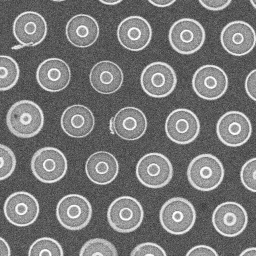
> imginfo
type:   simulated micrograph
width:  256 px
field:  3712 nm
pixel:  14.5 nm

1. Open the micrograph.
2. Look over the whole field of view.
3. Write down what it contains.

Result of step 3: an array of small figures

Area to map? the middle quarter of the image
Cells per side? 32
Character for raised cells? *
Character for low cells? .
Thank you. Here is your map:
.*******.....********.....******
.******.......******.......*****
.******..***..******...*...*****
.******..***...****...***...****
.******...**..*****...***...****
*******.......******...*....****
********.....*******.......*****
*********************.....******
********************************
********************************
**..****************************
*.....********.....**********.**
.......******.......*******.....
..***..******.......******......
..***..*****...***..******...**.
..**...******..***...*****..***.
.......******.......******..***.
*.....********.....*******......
***************...*********.....
*****************************..*
********************************
********************************
********...***********.*********
******......********.....*******
******.......******.......******
*****...***..*****...**....*****
******..***..*****...***...****.
******.......*****....*....****.
*******.....*******.......*****.
********...*********......******
*********************...********
********************************